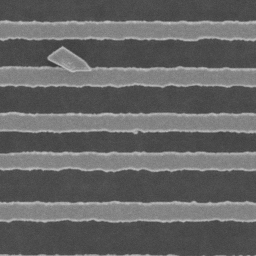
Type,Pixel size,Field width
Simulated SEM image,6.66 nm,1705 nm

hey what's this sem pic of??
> lines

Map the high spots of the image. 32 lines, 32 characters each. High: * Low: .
................................
................................
................................
********************************
********************************
................................
.......**.......................
......****......................
*****************.********..*...
********************************
********************************
................................
................................
................................
********************************
********************************
....*..*......................**
................................
................................
********************************
********************************
................................
................................
................................
................................
********************************
********************************
********************************
................................
................................
................................
................................